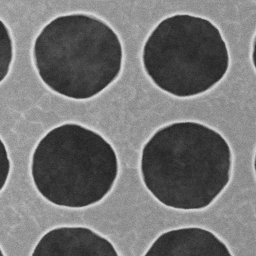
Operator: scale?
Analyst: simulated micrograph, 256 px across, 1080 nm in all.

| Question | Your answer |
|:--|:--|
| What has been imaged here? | holes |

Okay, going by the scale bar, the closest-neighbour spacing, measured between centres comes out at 459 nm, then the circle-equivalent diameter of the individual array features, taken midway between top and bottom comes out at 357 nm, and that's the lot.